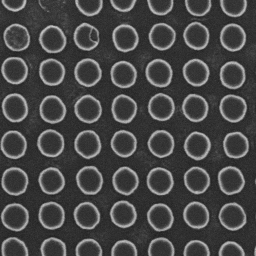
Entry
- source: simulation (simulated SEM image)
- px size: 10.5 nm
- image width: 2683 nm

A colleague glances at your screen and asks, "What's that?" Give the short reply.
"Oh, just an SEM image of a regular array of raised bodies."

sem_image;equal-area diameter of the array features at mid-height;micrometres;0.264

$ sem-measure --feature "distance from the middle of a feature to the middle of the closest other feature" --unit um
0.364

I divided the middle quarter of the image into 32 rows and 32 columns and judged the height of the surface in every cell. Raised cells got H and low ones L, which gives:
LLLHHHHHHLLLLHHHHLLLLHHHHHLLLLHH
LLLHHHHHHLLLHHHHHHLLLHHHHHHLLLHH
LLLHHHHHHLLLHHHHHHLLLHHHHHHLLLHH
LLLHHHHHHLLLHHHHHHLLLHHHHHHLLLLH
LLLLHHHHLLLLLHHHHLLLLLHHHHLLLLLH
LLLLLLLLLLLLLLHHLLLLLLLLLLLLLLLL
LLLLLLLLLLLLLLLLLLLLLLLLLLLLLLLL
LLLLLLLLLLLLLLLLLLLLLLLLLLLLLLLL
LLLLLHHLLLLLLHHHLLLLLLHHHHLLLLLH
LLLLHHHHHLLLLHHHHHLLLHHHHHHLLLHH
LLLHHHHHHLLLHHHHHHLLLHHHHHHLLLHH
LLLHHHHHHLLLHHHHHHLLLHHHHHHLLLHH
LLLHHHHHHLLLHHHHHHLLLLHHHHHLLLHH
LLLLHHHHLLLLLHHHHLLLLLLHHHLLLLLH
LLLLLLLLLLLLLLLLLLLLLLLLLLLLLLLL
LLLLLLLLLLLLLLLLLLLLLLLLLLLLLLLL
LLLLLLLLLLLLLLLLLLLLLLLLLLLLLLLL
LLLLHHHHLLLLLHHHHLLLLLLHHHLLLLLL
LLLHHHHHHLLLHHHHHHLLLLHHHHHLLLLH
LLLHHHHHHLLLHHHHHHLLLHHHHHHLLLHH
LLLHHHHHHLLLHHHHHHLLLHHHHHHLLLHH
LLLHHHHHHLLLLHHHHHLLLLHHHHHLLLHH
LLLLHHHHLLLLLLHHHLLLLLLHHHLLLLLH
LLLLLLLLLLLLLLLLLLLLLLLLLLLLLLLL
LLLLLLLLLLLLLLLLLLLLLLLLLLLLLLLL
LLLLLLLLLLLLLLLLLLLLLLLLLLLLLLLL
LLLLHHHHLLLLLLHHHLLLLLHHHLLLLLLH
LLLLHHHHHLLLLHHHHHLLLHHHHHLLLLHH
LLLHHHHHHLLLLHHHHHLLLHHHHHHLLLHH
LLLHHHHHHLLLLHHHHHLLLHHHHHHLLLHH
LLLLHHHHHLLLLHHHHHLLLHHHHHHLLLLH
LLLLLHHHHLLLLHHHHLLLLLHHHHLLLLLL